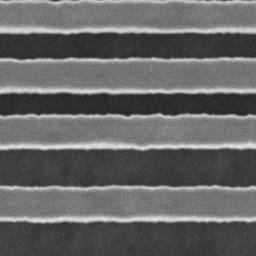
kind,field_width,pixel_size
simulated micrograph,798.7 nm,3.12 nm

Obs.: lines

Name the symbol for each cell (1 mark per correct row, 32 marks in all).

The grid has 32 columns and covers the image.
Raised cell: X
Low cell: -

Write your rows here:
XXXXXXXXXXXXXXXXXXXXXXXXXXXXXXXX
XXXXXXXXXXXXXXXXXXXXXXXXXXXXXXXX
XXXXXXXXXXXXXXXXXXXXXXXXXXXXXXXX
XXXXXXXXXXXXXXXXXXXXXXXXXXXXXXXX
--------------------------------
--------------------------------
--------------------------------
XXXXXXXXXXXXXXXXXXXXXXXXXXXXXXXX
XXXXXXXXXXXXXXXXXXXXXXXXXXXXXXXX
XXXXXXXXXXXXXXXXXXXXXXXXXXXXXXXX
XXXXXXXXXXXXXXXXXXXXXXXXXXXXXXXX
XXXXXXXXXXXXXXXXXXXXXXXXXXXXXXXX
--------------------------------
--------------------------------
XXXXXXXXXXXXXXXXXXXXXXXXXXXXXXXX
XXXXXXXXXXXXXXXXXXXXXXXXXXXXXXXX
XXXXXXXXXXXXXXXXXXXXXXXXXXXXXXXX
XXXXXXXXXXXXXXXXXXXXXXXXXXXXXXXX
XXXXXXXXXXXXXXXXXXXXXXX-XXXXXXX-
--------------------------------
--------------------------------
--------------------------------
--------------------------------
XXXXXXXXXX-XXXXXXXXXXXXXXXXXXX-X
XXXXXXXXXXXXXXXXXXXXXXXXXXXXXXXX
XXXXXXXXXXXXXXXXXXXXXXXXXXXXXXXX
XXXXXXXXXXXXXXXXXXXXXXXXXXXXXXXX
XXXXXXXXXXXXXXXXXXXXXXXXXXXXXXXX
--------------------------------
--------------------------------
--------------------------------
--------------------------------